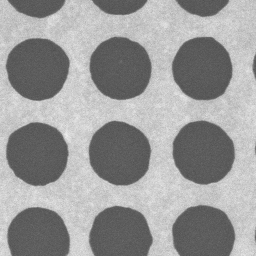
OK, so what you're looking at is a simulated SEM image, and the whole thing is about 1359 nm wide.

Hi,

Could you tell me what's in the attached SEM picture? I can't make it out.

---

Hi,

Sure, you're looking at holes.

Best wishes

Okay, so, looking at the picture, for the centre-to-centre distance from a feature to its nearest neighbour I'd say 82.4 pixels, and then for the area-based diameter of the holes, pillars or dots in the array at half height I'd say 334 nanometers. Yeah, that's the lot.